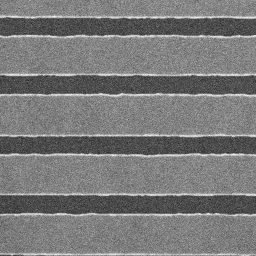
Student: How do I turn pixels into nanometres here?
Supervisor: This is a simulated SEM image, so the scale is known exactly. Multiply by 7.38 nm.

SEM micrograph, lines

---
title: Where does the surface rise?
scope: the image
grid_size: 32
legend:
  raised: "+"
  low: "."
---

++++++++++++++++++++++++++++++++
++++++++++++++++++++++++++++++++
................................
................................
.+++++...++.+++++++++++..+...+.+
++++++++++++++++++++++++++++++++
++++++++++++++++++++++++++++++++
++++++++++++++++++++++++++++++++
++++++++++++++++++++++++++++++++
................................
................................
................................
++++++++++++++++++++++++++++++++
++++++++++++++++++++++++++++++++
++++++++++++++++++++++++++++++++
++++++++++++++++++++++++++++++++
++++++++++++++++++++++++++++++++
................................
................................
++++++++++++++++++++++++++++++++
++++++++++++++++++++++++++++++++
++++++++++++++++++++++++++++++++
++++++++++++++++++++++++++++++++
++++++++++++++++++++++++++++++++
................................
................................
................................
++++++++++++++++++++++++++++++++
++++++++++++++++++++++++++++++++
++++++++++++++++++++++++++++++++
++++++++++++++++++++++++++++++++
++++++++++++++++++++++++++++++++